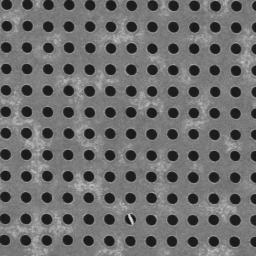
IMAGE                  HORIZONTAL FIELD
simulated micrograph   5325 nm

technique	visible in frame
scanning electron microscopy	a regular array of holes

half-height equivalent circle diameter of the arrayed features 226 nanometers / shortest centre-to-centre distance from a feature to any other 431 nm